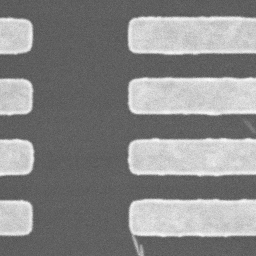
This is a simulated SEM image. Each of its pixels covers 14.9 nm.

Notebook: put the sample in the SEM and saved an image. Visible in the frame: wiring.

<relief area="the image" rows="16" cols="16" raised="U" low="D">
DDDDDDDDDDDDDDDD
UUDDDDDDUUUUUUUU
UUDDDDDDUUUUUUUU
DDDDDDDDDDDDDDDD
DDDDDDDDDDDDDDDD
UUDDDDDDUUUUUUUU
UUDDDDDDUUUUUUUU
DDDDDDDDDDDDDDDD
DDDDDDDDDDDDDDDD
UUDDDDDDUUUUUUUU
UUDDDDDDUUUUUUUU
DDDDDDDDDDDDDDDD
DDDDDDDDDDDDDDDD
UUDDDDDDUUUUUUUU
UUDDDDDDUUUUUUUU
DDDDDDDDDDDDDDDD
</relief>